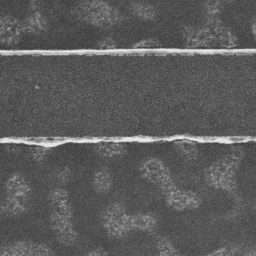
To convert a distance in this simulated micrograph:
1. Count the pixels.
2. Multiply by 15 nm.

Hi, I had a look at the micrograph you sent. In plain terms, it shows one or a few lines or trenches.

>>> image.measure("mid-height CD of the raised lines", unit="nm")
1350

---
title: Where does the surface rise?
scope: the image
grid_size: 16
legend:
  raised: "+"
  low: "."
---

................
................
................
++++++++++++++++
++++++++++++++++
++++++++++++++++
++++++++++++++++
++++++++++++++++
++++++++++++++++
................
................
................
................
................
................
................